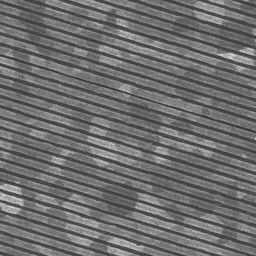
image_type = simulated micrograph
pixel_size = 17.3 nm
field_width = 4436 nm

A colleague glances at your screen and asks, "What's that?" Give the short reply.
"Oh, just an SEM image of parallel lines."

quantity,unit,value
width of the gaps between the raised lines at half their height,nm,74.6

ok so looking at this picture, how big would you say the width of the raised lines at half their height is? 91.2 nanometers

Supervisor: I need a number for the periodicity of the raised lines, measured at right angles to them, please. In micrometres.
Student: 0.174